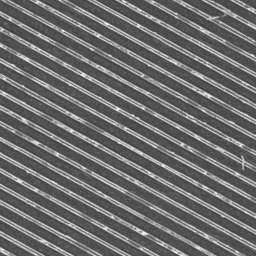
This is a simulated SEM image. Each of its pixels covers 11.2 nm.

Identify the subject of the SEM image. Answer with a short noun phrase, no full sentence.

parallel lines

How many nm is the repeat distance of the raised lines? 154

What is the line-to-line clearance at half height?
114 nanometers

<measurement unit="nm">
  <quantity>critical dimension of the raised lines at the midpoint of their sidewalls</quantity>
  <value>37.9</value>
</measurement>